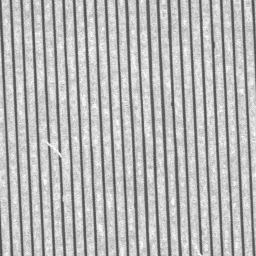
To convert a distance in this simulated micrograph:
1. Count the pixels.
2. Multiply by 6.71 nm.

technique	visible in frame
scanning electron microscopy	parallel lines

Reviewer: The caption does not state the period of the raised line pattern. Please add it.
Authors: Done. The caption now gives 70.5 nm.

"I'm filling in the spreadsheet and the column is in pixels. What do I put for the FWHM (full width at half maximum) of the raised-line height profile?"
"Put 7.87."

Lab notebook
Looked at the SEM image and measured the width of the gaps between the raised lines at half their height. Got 0.0176 µm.